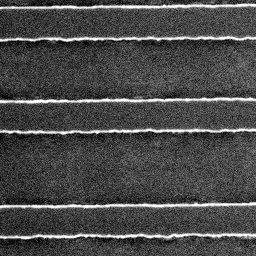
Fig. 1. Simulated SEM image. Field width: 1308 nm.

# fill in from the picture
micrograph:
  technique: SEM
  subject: lines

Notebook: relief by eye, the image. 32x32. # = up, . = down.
................................
################################
################################
################################
################################
................................
................................
................................
................................
................................
................................
................................
.............###..##############
################################
################################
################################
.############...................
................................
................................
................................
................................
................................
................................
................................
................................
...............................#
################################
################################
################################
#######################...##....
................................
................................